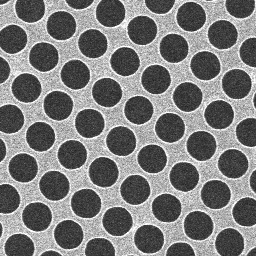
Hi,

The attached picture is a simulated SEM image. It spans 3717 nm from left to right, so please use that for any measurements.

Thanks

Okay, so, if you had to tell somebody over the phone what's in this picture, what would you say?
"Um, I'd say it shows a regular array of holes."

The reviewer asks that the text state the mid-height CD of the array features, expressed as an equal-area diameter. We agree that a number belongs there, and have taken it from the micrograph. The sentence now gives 432 nm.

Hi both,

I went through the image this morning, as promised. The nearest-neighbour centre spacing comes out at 517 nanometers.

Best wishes